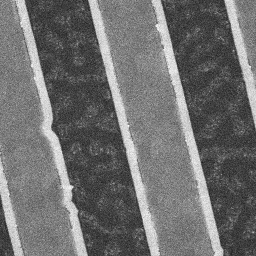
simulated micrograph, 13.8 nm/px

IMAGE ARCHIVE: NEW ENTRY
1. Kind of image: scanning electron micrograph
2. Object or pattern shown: one or a few lines or trenches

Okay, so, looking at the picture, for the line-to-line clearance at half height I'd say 981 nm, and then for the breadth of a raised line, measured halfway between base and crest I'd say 60.8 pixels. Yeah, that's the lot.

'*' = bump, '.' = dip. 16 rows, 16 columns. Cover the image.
*.....****....**
**....****.....*
**....****.....*
**.....****....*
**.....****....*
***....****.....
***....****.....
***.....****....
***.....****....
****....****....
****....****....
****.....****...
****.....****...
.****....****...
.****....****...
.****.....****..